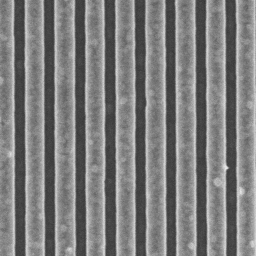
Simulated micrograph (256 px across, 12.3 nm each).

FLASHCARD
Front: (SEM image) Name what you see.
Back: parallel lines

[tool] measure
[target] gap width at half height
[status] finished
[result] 142 nanometers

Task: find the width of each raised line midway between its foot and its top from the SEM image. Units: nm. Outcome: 241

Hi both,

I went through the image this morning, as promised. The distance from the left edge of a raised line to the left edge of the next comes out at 373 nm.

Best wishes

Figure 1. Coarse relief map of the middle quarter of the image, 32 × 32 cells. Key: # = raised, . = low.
###...####...#####...####...####
###...####...#####...####...####
###...####...#####...####...####
###...####...#####...####...####
###..#####...#####...####...####
###..#####...#####...####...####
###..#####...#####...####...####
###..#####...#####...####...####
###..#####...#####...####...####
###..#####...#####...####...####
###..#####...#####...####...####
###..#####...#####...####...####
###..#####...#####...####...####
###..#####...#####...####...####
###..#####...#####...####...####
###...####...#####...####...####
###...####...#####...####...####
###...####...####....####...####
###...####...####....####...####
###...####...#####...####...####
###...####...#####...####...####
###...####...#####...####...####
###...####...#####...####...####
###...####...#####...####...####
###...####...#####...####...####
###...####...#####...####...####
###...####...#####...####...####
###...####...#####...####...####
###...####...#####...####...####
###...####...#####...####...####
###...####...#####...####...####
###...####...#####...####...####